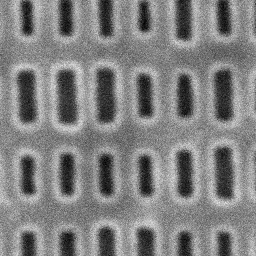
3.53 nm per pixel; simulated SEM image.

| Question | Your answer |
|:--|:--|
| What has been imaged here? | a regular array of holes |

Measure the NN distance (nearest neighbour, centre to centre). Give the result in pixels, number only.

39